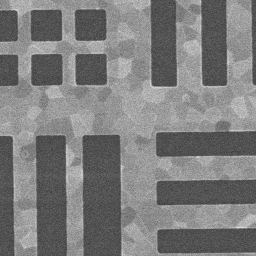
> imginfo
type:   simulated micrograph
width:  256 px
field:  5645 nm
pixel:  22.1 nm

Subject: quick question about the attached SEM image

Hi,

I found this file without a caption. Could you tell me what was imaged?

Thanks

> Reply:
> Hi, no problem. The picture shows groups of lines, slits or small figures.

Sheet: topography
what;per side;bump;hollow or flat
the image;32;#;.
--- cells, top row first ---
###################...###...###.
..##....#....######...###...###.
..##....#....######...###...###.
..##....#....######...###...###.
..##....#....######...###...###.
###################...###...###.
###################...###....##.
..##....#....######...###....##.
..##....#....######...###....##.
..##....#.....#####...###....##.
..##....##...######...###...####
################################
################################
################################
################################
################################
####################............
..##....##.....####.............
..##....##.....####.............
..##....##.....#####............
..##....##.....#################
..##....##.....#################
..##....##.....#####..##........
..##....##.....####.............
..##....##.....####.............
..##....##.....#####............
..##....##.....#################
..##....##.....#################
..##....##.....##########.......
..##....##.....#####............
..##....##.....#####............
..##....##.....#####............